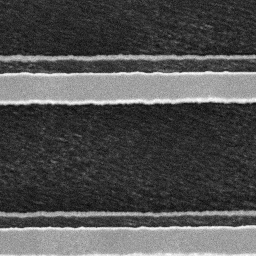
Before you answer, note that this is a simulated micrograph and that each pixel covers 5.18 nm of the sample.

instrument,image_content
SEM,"lines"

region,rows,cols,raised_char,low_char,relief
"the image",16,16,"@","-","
----------------
----------------
----------------
----------------
@@@@@@@@@@@@@@@@
@@@@@@@@@@@@@@@@
@@--@-----------
----------------
----------------
----------------
----------------
----------------
----------------
@-@@@@@@@@@@@@@@
@@@@@@@@@@@@@@@@
@@@@@@@@@@@@@@@@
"